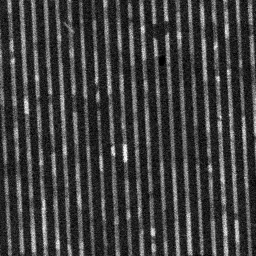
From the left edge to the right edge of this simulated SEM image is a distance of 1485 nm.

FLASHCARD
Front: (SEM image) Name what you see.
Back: parallel lines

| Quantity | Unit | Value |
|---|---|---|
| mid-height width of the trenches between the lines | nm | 51.4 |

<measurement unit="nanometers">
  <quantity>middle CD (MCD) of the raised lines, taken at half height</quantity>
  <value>17.4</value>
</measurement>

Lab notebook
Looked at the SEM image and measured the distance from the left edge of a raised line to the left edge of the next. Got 0.0696 µm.